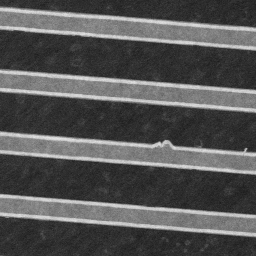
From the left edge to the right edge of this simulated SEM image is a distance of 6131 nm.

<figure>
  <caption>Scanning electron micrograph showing parallel lines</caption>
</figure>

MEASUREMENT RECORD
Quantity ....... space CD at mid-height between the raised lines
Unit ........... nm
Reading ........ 1050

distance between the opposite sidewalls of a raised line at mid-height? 442 nm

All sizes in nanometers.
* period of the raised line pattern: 1480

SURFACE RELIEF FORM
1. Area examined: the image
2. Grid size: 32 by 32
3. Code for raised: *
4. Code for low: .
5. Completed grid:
................................
***.............................
*****************...............
.***************************....
..............******************
..........................******
................................
................................
................................
*******.........................
*******************.............
....***************************.
................****************
............................****
................................
................................
................................
*********.......................
**********************..........
......**************************
...................*************
..............................**
................................
................................
*...............................
*************...................
************************........
.........***********************
......................**********
................................
................................
................................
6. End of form